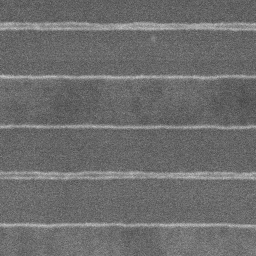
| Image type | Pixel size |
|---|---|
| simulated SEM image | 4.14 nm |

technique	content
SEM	lines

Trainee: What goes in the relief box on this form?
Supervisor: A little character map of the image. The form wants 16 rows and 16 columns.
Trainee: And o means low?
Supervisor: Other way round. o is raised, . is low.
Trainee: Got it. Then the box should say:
................
................
................
................
................
oooooooooooooooo
oooooooooooooooo
oooooooooooooooo
................
................
................
................
................
................
oooooooooooooooo
oooooooooooooooo